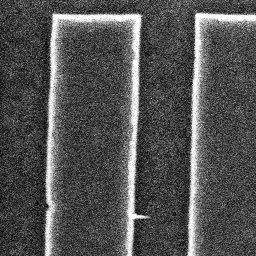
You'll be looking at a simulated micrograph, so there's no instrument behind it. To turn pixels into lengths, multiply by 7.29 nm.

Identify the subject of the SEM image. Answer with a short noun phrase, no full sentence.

one or a few lines or trenches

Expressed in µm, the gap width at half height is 0.428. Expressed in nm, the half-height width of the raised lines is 618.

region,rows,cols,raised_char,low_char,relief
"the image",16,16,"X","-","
----------------
---XXXXXX---XXXX
---XXXXXX---XXXX
---XXXXXX---XXXX
---XXXXXX---XXXX
---XXXXXX---XXXX
---XXXXXX---XXXX
---XXXXX----XXXX
---XXXXX----XXXX
---XXXXX----XXXX
---XXXXX----XXXX
---XXXXX----XXXX
---XXXXX----XXXX
---XXXXX----XXXX
---XXXXX----XXXX
---XXXXX----XXXX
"